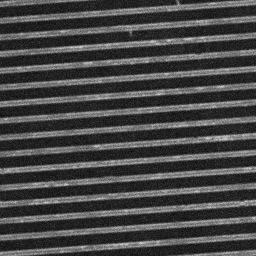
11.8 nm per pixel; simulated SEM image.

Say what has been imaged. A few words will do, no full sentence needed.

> parallel lines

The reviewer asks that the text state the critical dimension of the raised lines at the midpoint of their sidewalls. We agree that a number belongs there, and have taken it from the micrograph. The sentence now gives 0.0513 um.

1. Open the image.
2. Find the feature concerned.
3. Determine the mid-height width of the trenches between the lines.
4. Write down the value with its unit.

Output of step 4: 144 nanometres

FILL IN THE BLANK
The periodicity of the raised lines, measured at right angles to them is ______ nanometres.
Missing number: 196